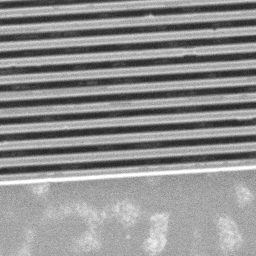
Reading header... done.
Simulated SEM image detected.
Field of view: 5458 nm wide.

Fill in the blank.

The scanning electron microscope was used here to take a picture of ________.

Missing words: parallel lines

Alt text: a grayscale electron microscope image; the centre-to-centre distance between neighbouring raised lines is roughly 353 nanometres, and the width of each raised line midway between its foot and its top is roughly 165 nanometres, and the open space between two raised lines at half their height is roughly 8.73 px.